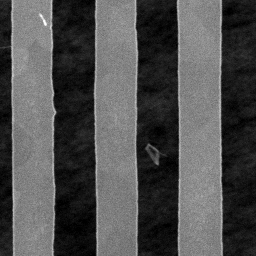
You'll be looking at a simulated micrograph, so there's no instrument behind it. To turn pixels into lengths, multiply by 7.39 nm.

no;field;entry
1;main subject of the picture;one or a few lines or trenches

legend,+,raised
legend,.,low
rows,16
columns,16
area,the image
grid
.++...++...+++..
.++...++...+++..
.++...+++..+++..
.++...+++..+++..
.++...+++..+++..
.++...+++..+++..
.++...+++..+++..
.++...+++..+++..
.++...++...+++..
.++...++.+.+++..
.++...+++..+++..
.++...+++..+++..
.++...+++..+++..
.++...+++..+++..
.++...+++..+++..
.++...+++..+++..